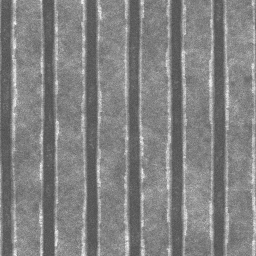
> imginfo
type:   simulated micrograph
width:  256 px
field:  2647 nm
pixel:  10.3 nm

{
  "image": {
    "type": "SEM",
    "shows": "parallel lines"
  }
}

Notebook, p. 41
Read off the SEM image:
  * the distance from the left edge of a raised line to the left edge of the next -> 440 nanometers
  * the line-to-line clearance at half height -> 0.123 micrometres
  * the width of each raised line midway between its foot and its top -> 30.7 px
